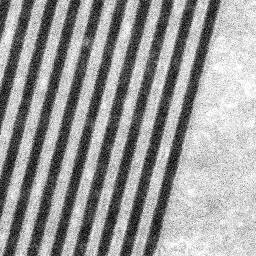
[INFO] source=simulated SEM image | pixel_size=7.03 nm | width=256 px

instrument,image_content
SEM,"parallel lines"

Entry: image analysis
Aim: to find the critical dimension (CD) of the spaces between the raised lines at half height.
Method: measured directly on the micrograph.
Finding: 51.8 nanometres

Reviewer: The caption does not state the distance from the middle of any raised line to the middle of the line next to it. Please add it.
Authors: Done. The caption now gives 158 nm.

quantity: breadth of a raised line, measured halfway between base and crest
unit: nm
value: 107